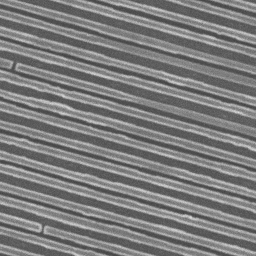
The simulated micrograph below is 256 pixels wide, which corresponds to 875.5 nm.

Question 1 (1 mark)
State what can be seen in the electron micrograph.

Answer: parallel lines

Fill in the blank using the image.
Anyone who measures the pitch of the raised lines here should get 51.1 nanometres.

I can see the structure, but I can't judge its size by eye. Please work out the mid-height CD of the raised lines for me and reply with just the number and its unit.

29.3 nm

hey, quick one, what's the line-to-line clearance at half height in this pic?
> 0.0264 µm